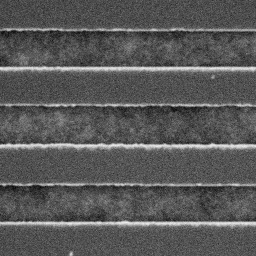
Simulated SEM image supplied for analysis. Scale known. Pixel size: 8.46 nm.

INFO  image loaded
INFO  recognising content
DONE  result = lines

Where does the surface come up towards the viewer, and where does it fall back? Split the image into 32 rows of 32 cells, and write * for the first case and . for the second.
********************************
********************************
********************************
********************************
................................
................................
................................
................................
**********.***************..**.*
********************************
********************************
********************************
********************************
................................
................................
................................
................................
................................
********************************
********************************
********************************
********************************
********************************
................................
................................
................................
................................
................................
********************************
********************************
********************************
********************************